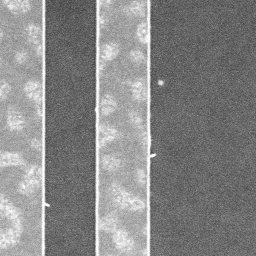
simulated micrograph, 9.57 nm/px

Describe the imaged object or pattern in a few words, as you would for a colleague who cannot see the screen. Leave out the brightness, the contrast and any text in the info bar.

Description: one or a few lines or trenches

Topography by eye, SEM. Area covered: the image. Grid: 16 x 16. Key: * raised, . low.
***...***.......
***...***.......
***...***.......
***...***.......
***...***.......
***...***.......
***...***.......
***...***.......
***...***.......
***...***.......
***...***.......
***...***.......
***...***.......
***...***.......
***...***.......
***...***.......